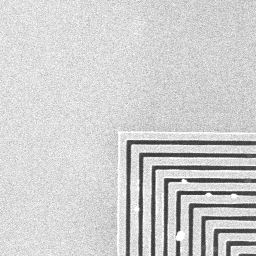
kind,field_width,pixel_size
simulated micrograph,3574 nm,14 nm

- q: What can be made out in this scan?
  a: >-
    groups of lines, slits or small figures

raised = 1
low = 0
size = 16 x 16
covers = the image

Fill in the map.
0000000000000000
0000000000000000
0000000000000000
0000000000000000
0000000000000000
0000000000000000
0000000000000000
0000000000000000
0000000001100000
0000000011111111
0000000011111111
0000000011111111
0000000011101110
0000000011101111
0000000111111111
0000000111101100